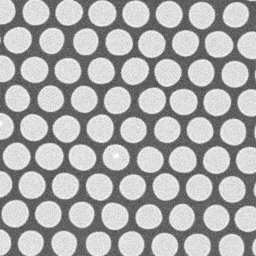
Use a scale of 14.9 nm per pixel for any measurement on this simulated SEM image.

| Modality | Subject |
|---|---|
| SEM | an array of small figures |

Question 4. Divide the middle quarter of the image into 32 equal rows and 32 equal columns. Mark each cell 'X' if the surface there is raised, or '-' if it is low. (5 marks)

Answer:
XXXX--XXXXXX---XXXXXX--XXXXXX---
XXXX--XXXXXX--XXXXXXX--XXXXXX--X
XXXX--XXXXXX--XXXXXXX--XXXXXX--X
XXXX--XXXXXX---XXXXX---XXXXXX--X
XXX-----XXX----XXXX-----XXXX----
-------------------------X------
---XXXX-----XXX------XXX--------
--XXXXXX---XXXXX---XXXXXX--XXXXX
--XXXXXX--XXXXXXX--XXXXXX--XXXXX
--XXXXXX--XXXXXXX--XXXXXX--XXXXX
--XXXXXX--XXXXXX---XXXXXX--XXXXX
---XXXX----XXXXX----XXXX---XXXXX
-----------------------------XX-
XX-----XXXX--------------XX-----
XXX---XXXXXX---XXXXX---XXXXX----
XXXX--XXXXXX--XXXXXX---XXXXXX--X
XXXX--XXXXXX--XXXXXX---XXXXXX--X
XXXX--XXXXXX--XXXXXX---XXXXXX--X
XXX----XXXXX---XXXXX---XXXXX----
---------X------XX-------XX-----
---XX------XXX------------------
--XXXXX---XXXXXX---XXXX----XXXXX
-XXXXXXX--XXXXXX---XXXXX---XXXXX
-XXXXXXX--XXXXXX--XXXXXXX-XXXXXX
--XXXXXX--XXXXXX--XXXXXXX-XXXXXX
--XXXXX----XXXXX---XXXXX---XXXXX
--------------------XXX-----XXXX
X-----------------------XX------
XXX---XXXXX----XXXX----XXXXX----
XXXX--XXXXXX--XXXXXX--XXXXXX---X
XXXX--XXXXXX--XXXXXX--XXXXXXX--X
XXX---XXXXXX--XXXXXX--XXXXXXX--X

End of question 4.